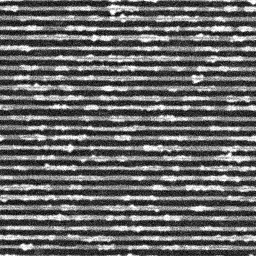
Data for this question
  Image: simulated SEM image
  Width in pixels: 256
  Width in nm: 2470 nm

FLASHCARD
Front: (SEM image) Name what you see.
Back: parallel lines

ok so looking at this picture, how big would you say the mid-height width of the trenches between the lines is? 0.0639 micrometres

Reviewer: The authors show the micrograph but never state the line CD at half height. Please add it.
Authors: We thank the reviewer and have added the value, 3.75 pixels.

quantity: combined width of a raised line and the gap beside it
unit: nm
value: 96